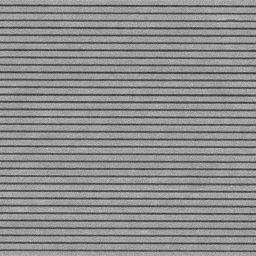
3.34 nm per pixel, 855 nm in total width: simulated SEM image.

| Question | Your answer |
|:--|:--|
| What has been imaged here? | parallel lines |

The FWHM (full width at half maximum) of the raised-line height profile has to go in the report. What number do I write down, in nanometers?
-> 18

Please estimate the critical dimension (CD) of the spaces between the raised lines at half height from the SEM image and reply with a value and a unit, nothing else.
6.3 nm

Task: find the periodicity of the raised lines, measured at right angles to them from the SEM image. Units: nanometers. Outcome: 24.8